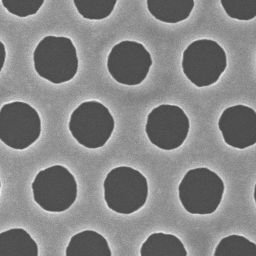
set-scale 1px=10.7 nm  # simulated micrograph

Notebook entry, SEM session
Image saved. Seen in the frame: a regular array of holes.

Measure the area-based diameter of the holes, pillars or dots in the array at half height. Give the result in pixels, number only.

45.9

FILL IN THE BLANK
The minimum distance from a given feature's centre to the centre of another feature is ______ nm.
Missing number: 772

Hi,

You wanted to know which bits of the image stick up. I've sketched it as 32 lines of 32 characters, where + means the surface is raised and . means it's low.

.....++++.....++++......++++....
+...++++++....+++++.....++++....
++++++++++++++++++++...+++++++.+
++++++++++++++++++++++++++++++++
++++++.+++++++++++++++++++++++++
+++++....++++++...++++++...+++++
.+++......++++....+++++.....++++
.+++......+++......++++.....++++
++++......+++......++++.....++++
+++++....+++++....+++++....+++++
+++++++++++++++..+++++++..++++++
++++++++++++++++++++++++++++++++
++++++++++++++++++++++++++++++++
....++++++...++++++....+++++...+
.....++++.....+++++....+++++....
.....++++.....++++......+++.....
.....++++.....++++......++++....
.....+++++...++++++....+++++....
+..++++++++.++++++++..++++++++.+
++++++++++++++++++++++++++++++++
++++++++++++++++++++++++++++++++
+++++....+++++...++++++....+++++
++++.....++++.....+++++.....++++
++++......+++......+++......++++
++++......+++.....++++......++++
+++++....++++.....+++++....+++++
++++++++++++++...+++++++...+++++
++++++++++++++++++++++++++++++++
++++++++++++++++++++++++++++++++
....+++++....++++++...+++++++.++
.....++++.....++++.....++++.....
.....+++......++++.....++++.....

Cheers